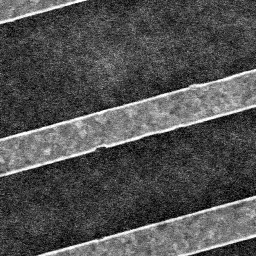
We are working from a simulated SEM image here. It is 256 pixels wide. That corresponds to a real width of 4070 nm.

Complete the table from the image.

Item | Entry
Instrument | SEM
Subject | one or a few lines or trenches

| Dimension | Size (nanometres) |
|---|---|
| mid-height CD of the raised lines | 548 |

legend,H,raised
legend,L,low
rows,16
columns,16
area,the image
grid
HHHLLLLLLLLLLLLL
LLLLLLLLLLLLLLLL
LLLLLLLLLLLLLLLL
LLLLLLLLLLLLLLLL
LLLLLLLLLLLLLLLH
LLLLLLLLLLLLHHHH
LLLLLLLLHHHHHHHH
LLLLLHHHHHHHHLLL
LHHHHHHHHLLLLLLL
HHHHHLLLLLLLLLLL
HHLLLLLLLLLLLLLL
LLLLLLLLLLLLLLLL
LLLLLLLLLLLLLLLH
LLLLLLLLLLLLHHHH
LLLLLLLLHHHHHHHH
LLLLHHHHHHHHHLLL